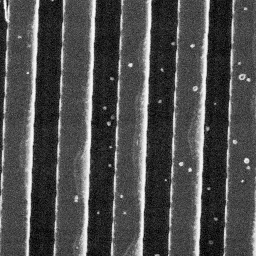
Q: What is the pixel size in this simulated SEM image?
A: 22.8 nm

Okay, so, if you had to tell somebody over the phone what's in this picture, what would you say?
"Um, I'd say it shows lines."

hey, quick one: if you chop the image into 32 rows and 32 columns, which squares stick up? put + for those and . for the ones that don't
.++++...++++...++++...++++...+++
.++++...++++...++++...++++...+++
.++++...++++...++++...++++...+++
.++++...++++...++++...++++...+++
.+++....++++...++++...++++...+++
.+++....++++...++++...++++...+++
.+++....++++...++++...++++...+++
.+++....++++...+++....++++...+++
.+++....++++...+++....++++...+++
.+++....++++...+++....++++...+++
.+++....+++....+++....++++...+++
.+++....+++....+++....++++...+++
.+++....+++....+++....++++...+++
.+++....+++....+++....++++...+++
.+++....+++....+++....+++....+++
++++...++++....+++....+++....+++
++++...++++....+++....+++....+++
++++...++++....+++....+++....+++
++++...++++....+++....+++...++++
++++...++++...++++....+++...++++
++++...++++...++++....+++...++++
++++...++++...++++....+++...++++
++++...++++...++++....+++...++++
++++...++++...++++...++++...++++
++++...++++...++++...++++...++++
++++...++++...++++...++++...++++
++++...++++...++++...++++...++++
++++...++++...++++...++++...++++
++++...++++...++++...++++...++++
++++...++++...++++...++++...++++
++++...++++...++++...++++...++++
++++...++++...++++...++++...++++